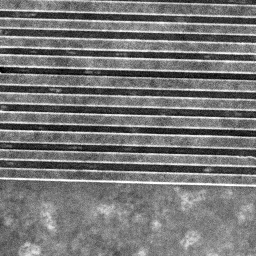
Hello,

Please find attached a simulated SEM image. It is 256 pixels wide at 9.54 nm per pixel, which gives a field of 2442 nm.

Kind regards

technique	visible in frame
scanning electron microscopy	parallel lines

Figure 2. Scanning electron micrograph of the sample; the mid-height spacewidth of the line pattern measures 75.1 nm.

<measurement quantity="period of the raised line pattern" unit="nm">179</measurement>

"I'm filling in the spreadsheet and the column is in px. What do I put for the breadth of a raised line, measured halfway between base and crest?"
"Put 11.4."